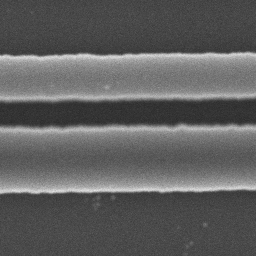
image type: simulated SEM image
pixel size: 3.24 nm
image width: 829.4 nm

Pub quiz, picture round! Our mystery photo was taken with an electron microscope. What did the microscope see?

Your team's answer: lines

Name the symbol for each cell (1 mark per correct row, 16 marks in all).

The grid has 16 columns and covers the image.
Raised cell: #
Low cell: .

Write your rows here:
................
................
................
##.#############
################
################
................
................
################
################
################
################
................
................
................
................